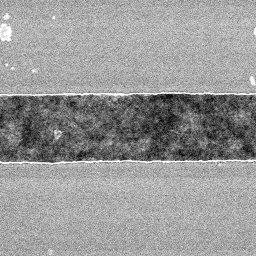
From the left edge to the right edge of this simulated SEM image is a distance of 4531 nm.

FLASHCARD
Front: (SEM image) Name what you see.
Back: one or a few lines or trenches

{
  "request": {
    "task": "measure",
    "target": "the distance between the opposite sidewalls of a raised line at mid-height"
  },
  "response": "67.6 px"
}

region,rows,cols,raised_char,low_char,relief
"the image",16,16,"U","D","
DDDDDDDDDDDDDDDD
DDDDDDDDDDDDDDDD
DDDDDDDDDDDDDDDD
DDDDDDDDDDDDDDDD
DDDDDDDDDDDDDDDD
DDDDDDDDDDDDDDDD
UUUUUUUUUUUUUUUU
UUUUUUUUUUUUUUUU
UUUUUUUUUUUUUUUU
UUUUUUUUUUUUUUUU
DDDDDDDDDDDDDDDD
DDDDDDDDDDDDDDDD
DDDDDDDDDDDDDDDD
DDDDDDDDDDDDDDDD
DDDDDDDDDDDDDDDD
DDDDDDDDDDDDDDDD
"